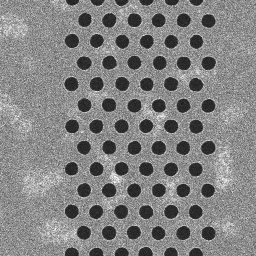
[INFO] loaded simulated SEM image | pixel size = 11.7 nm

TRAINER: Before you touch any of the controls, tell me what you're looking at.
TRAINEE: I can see a regular array of holes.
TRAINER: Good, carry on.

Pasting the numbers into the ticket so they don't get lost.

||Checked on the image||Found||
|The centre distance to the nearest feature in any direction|284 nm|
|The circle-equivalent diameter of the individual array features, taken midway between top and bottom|166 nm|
